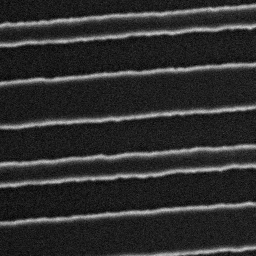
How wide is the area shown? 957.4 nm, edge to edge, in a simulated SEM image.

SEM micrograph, lines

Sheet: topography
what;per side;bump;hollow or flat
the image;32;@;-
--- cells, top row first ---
--------------------------------
----------------------@@@@@@@@@@
-------@@@@@@@@@@@@@@@@@@@@@@@@@
@@@@@@@@@@@@@@@@@@@@@@@@@@@@@---
@@@@@@@@@@@@@@@@----------------
@@@-----------------------------
--------------------------------
--------------------------------
-----------------------@@@@@@@@@
-----------@@@@@@@@@@@@@@@@@@@@@
@@@@@@@@@@@@@@@@@@@@@@@@@@@@@@@@
@@@@@@@@@@@@@@@@@@@@@@@@@@@@@@@@
@@@@@@@@@@@@@@@@@@@@@@@@@@@@@@@@
@@@@@@@@@@@@@@@@@@@@@@@@@@@@@@@@
@@@@@@@@@@@@@@@@@@@@------------
@@@@@@@-------------------------
--------------------------------
--------------------------------
----------------------------@@@@
------------@-@@@@@@@@@@@@@@@@@@
@@@@@@@@@@@@@@@@@@@@@@@@@@@@@@@@
@@@@@@@@@@@@@@@@@@@@@@----------
@@@@@@@@@@----------------------
--------------------------------
--------------------------------
------------------------------@@
----------------@@@@@@@@@@@@@@@@
----@@@@@@@@@@@@@@@@@@@@@@@@@@@@
@@@@@@@@@@@@@@@@@@@@@@@@@@@@@@@@
@@@@@@@@@@@@@@@@@@@@@@@@@@@@@@@@
@@@@@@@@@@@@@@@@@@@@@@@@@@@@@@@@
@@@@@@@@@@@@@@@@@@@@@@@@@@@-----